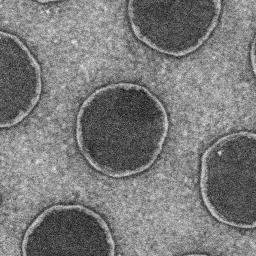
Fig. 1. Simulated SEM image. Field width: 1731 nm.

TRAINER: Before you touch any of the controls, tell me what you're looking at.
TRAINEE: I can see raised bodies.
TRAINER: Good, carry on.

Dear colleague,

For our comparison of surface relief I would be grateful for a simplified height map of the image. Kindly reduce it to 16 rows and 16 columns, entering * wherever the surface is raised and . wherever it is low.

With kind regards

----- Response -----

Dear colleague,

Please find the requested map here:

........******..
........*****...
*........****...
**..............
**..............
***....**.......
**...*****......
*....*****......
.....*****....**
.....*****...***
......***....***
.............***
.............***
...***........**
..*****.........
.******.........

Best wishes